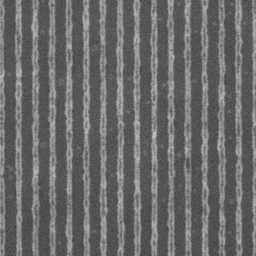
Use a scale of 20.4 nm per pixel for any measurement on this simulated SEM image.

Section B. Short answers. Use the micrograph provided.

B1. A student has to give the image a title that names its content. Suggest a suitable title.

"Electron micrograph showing parallel lines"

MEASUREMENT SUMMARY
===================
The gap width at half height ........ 0.265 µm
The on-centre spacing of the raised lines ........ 0.344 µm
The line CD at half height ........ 89.1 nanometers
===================